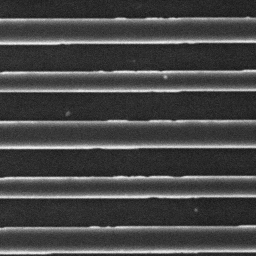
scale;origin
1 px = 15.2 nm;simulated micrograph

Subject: lines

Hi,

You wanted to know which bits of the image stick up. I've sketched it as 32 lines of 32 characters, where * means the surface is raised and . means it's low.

................................
................................
********************************
********************************
********************************
................................
................................
................................
................................
********************************
********************************
................................
................................
................................
................................
********************************
********************************
********************************
*...............................
................................
................................
................................
********************************
********************************
********************************
................................
................................
................................
********************************
********************************
********************************
*****************...............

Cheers